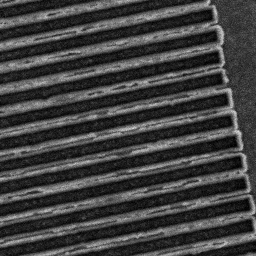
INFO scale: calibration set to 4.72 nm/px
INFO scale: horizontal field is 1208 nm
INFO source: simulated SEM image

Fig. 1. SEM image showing parallel lines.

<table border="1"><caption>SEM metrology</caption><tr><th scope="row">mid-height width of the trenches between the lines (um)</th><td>0.0642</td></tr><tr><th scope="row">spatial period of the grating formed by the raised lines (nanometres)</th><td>101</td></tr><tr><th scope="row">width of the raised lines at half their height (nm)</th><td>37.1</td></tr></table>